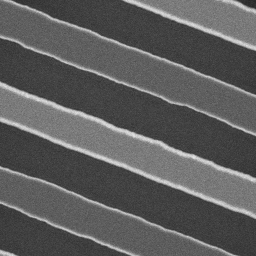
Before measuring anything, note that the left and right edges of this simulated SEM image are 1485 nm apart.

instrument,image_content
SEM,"lines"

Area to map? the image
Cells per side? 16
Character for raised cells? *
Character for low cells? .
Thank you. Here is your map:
**.......*******
****.......*****
.******.......**
...*******......
......******....
*.......*******.
****.......*****
******........**
..*******.......
.....*******....
........******..
***.......******
******.......***
..******........
....*******.....
.......*******..